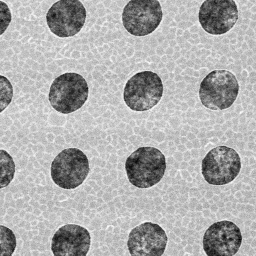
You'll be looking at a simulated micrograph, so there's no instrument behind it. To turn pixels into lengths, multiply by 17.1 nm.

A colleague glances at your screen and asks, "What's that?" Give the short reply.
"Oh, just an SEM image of holes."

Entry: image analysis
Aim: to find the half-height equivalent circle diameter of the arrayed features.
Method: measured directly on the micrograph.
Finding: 0.695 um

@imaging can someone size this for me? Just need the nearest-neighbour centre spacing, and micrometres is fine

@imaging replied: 1.29